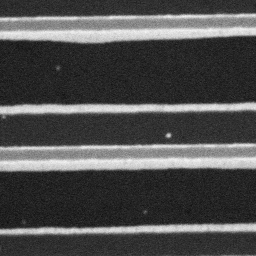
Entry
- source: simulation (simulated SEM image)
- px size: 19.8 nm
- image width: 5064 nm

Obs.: lines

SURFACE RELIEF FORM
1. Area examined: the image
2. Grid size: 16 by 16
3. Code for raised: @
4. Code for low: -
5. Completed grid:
@@@@@@@@@@@@@@@@
@@@@@@@@@@@@@@@@
----------------
----------------
----------------
----------------
----------------
@@@@@@@@@@@@@@@@
@@@@@@@@@@@@@@@@
@@@@@@@@@@@@@@@@
----------------
----------------
----------------
----------------
@@@@@@@@@@@@@@@@
@@@@@@@@@@@@@@@@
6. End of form